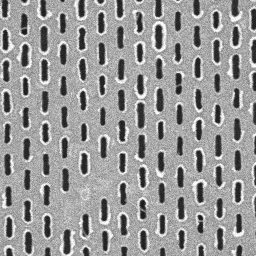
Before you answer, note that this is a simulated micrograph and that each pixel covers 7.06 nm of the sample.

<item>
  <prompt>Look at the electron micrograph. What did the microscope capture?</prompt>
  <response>a regular array of holes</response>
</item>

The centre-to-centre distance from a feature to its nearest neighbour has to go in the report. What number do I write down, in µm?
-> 0.172